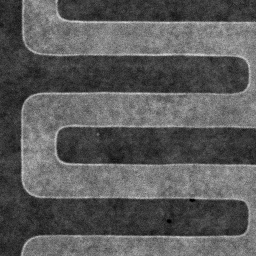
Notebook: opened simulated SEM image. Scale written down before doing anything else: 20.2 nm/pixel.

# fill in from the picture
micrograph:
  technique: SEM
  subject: groups of lines, slits or small figures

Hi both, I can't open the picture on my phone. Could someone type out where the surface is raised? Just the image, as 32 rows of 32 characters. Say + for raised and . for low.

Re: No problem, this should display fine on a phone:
...++++.........................
...++++.........................
...+++++........................
...+++++++++++++++++++++++++++++
...+++++++++++++++++++++++++++++
...+++++++++++++++++++++++++++++
....++++++++++++++++++++++++++++
...............................+
...............................+
...............................+
...............................+
..............................++
...+++++++++++++++++++++++++++++
...+++++++++++++++++++++++++++++
...+++++++++++++++++++++++++++++
...+++++++++++++++++++++++++++++
...++++.........................
...++++.........................
...++++.........................
...++++.........................
...++++++.......................
...+++++++++++++++++++++++++++++
...+++++++++++++++++++++++++++++
...+++++++++++++++++++++++++++++
....++++++++++++++++++++++++++++
...............................+
...............................+
...............................+
...............................+
.......++.....................++
...+++++++++++++++++++++++++++++
...+++++++++++++++++++++++++++++